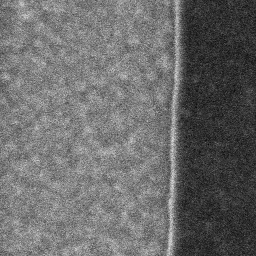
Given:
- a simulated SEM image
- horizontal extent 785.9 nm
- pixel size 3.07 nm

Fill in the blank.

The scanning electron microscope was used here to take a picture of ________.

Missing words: one or a few lines or trenches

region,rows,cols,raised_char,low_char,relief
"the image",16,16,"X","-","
-----------XXXXX
-----------XXXXX
-----------XXXXX
-----------XXXXX
-----------XXXXX
-----------XXXXX
-----------XXXXX
-----------XXXXX
-----------XXXXX
-----------XXXXX
-----------XXXXX
-----------XXXXX
-----------XXXXX
-----------XXXXX
-----------XXXXX
-----------XXXXX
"